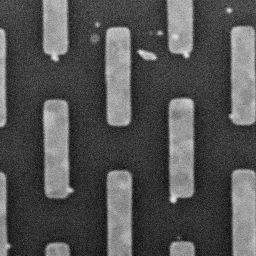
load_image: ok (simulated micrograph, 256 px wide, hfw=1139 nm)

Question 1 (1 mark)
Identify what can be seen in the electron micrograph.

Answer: groups of lines, slits or small figures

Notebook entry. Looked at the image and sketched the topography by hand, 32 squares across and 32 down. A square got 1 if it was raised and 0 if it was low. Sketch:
00000011000000000000011100000000
00000011000000000000011100000000
00000011000000000000011100000000
00000011000000000000011100000010
10000011000001110000011100000111
10000011000001110000011100000111
10000011000001110000001000000111
10000000000001110000000000000111
10000000000001110000000000000111
10000000000001110000000000000111
10000000000001110000000000000111
10000000000001110000000000000111
10000000000001110000001100000111
10000011000001110000011100000111
10000011000001110000011100000111
00000011000000110000011100000000
00000011000000000000011100000000
00000011000000000000011100000000
00000011000000000000011100000000
00000011000000000000011100000000
00000011000000000000011100000000
00000011000000110000011100000111
10000011000001110000011100000111
10000011000001110000011100000111
10000011000001110000001100000111
10000000000000110000000000000111
10000000000000110000000000000111
10000000000000110000000000000111
10000000000000110000000000000111
10000000000000110000000000000111
10000001000000110000001100000111
10000011100000110000011100000111